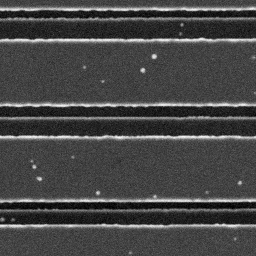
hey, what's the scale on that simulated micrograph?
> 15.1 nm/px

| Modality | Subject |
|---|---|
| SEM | lines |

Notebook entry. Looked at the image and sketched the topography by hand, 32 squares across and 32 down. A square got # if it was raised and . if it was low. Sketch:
################################
................................
................................
................................
................................
################################
################################
################################
################################
################################
################################
################################
################################
................................
................................
................................
................................
################################
################################
################################
################################
################################
################################
################################
################################
................................
................................
................................
################################
################################
################################
################################